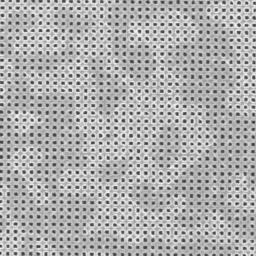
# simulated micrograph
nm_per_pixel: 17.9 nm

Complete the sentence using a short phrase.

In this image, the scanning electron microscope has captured a regular array of holes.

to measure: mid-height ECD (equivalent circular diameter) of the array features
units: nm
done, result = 75.5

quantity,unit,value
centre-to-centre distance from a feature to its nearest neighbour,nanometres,129